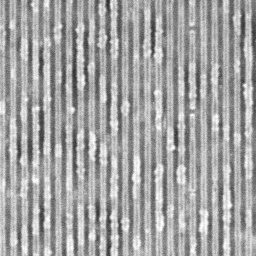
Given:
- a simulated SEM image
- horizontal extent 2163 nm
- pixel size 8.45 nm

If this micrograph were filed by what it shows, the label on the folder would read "parallel lines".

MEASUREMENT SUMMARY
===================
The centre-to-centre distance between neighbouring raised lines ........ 0.0946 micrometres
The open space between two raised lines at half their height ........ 59.1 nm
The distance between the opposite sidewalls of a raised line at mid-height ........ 37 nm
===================